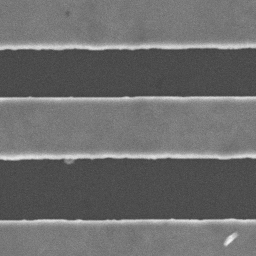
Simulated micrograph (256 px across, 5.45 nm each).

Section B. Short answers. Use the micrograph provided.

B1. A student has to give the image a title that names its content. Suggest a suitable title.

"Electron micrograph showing lines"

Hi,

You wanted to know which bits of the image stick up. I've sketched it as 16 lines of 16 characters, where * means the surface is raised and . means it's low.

****************
****************
****************
................
................
................
****************
****************
****************
****************
................
................
................
................
****************
****************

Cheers